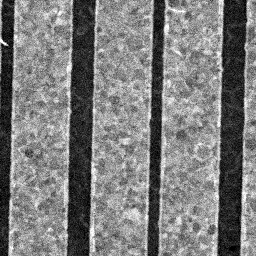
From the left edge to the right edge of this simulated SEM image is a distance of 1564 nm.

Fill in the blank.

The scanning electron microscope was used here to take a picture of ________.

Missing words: one or a few lines or trenches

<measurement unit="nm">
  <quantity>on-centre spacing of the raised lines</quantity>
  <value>460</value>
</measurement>